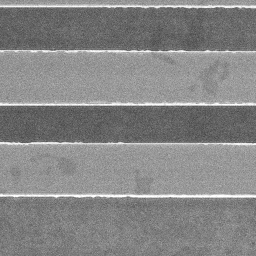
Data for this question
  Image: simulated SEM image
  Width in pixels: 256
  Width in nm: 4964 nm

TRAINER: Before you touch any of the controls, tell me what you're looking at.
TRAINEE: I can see lines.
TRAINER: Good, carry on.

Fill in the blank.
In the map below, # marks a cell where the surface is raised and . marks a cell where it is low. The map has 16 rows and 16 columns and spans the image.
................
................
................
################
################
################
################
................
................
################
################
################
................
................
................
................